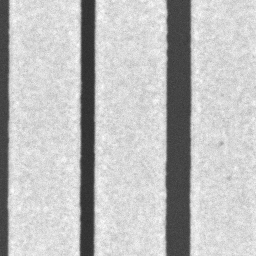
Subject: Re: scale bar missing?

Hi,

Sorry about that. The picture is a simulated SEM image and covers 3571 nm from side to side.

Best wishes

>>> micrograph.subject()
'lines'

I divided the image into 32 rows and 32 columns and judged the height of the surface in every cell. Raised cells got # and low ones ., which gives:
.#########..#########...########
.#########..#########...########
.#########..#########...########
.#########..#########...########
.#########..#########...########
.#########..#########...########
.#########..#########...########
.#########..#########...########
.#########..#########...########
.#########..#########...########
.#########..#########...########
.#########..#########...########
.#########..#########...########
.#########..#########...########
.#########..#########...########
.#########..#########...########
.#########..#########...########
.#########..#########...########
.#########..#########...########
.#########..#########...########
.#########..#########...########
.#########..#########...########
.#########..#########...########
.#########..#########...########
.#########..#########...########
.#########..#########...########
.#########..#########...########
.#########..#########...########
.#########..#########...########
.#########..#########...########
.#########..#########...########
.#########..#########...########